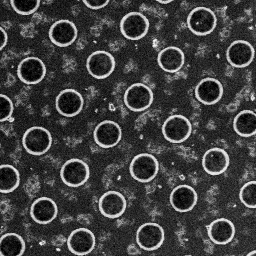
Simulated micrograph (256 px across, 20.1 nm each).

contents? a regular array of raised bodies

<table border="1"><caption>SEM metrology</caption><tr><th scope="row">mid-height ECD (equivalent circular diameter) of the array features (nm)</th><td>513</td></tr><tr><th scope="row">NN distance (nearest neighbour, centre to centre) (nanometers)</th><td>982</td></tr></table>